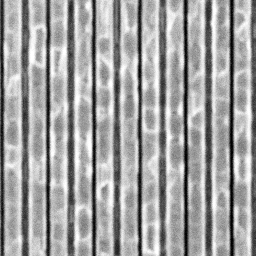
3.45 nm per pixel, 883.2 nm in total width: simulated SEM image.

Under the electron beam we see parallel lines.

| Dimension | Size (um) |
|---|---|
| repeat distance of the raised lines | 0.0792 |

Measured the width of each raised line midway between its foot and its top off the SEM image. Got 60.3 nanometres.